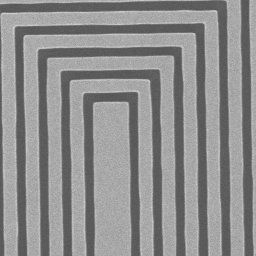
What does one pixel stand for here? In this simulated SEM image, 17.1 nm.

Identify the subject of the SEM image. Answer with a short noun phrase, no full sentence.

groups of lines, slits or small figures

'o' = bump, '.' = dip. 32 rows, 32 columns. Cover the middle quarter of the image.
ooooooooooooooooooooooooooo...oo
oooooooooooooo..........ooo...oo
........................ooo...oo
........................ooo...oo
..ooooooooooooooooooo...ooo...oo
.oooooooooooooooooooo...ooo...oo
.ooooooooooooooooooooo..ooo...oo
.oooo..............ooo..ooo...oo
.oooo..............ooo..ooo...oo
.oooo..............ooo..ooo...oo
..ooo..ooooooooo...ooo..ooo...oo
..ooo..ooooooooo...ooo..ooo...oo
..ooo..ooooooooo...ooo..ooo...oo
..ooo..ooooooooo...ooo..ooo...oo
..ooo..ooooooooo...ooo..ooo...oo
..ooo..ooooooooo...ooo..ooo...oo
..ooo..ooooooooo...ooo..ooo...oo
..ooo..ooooooooo...ooo..ooo...oo
..ooo..ooooooooo...ooo..ooo...oo
..ooo...oooooooo...ooo..ooo...oo
..ooo...oooooooo...ooo..ooo...oo
..ooo...oooooooo...ooo..ooo...oo
..ooo...oooooooo...ooo..oooo..oo
..ooo...oooooooo...ooo..oooo..oo
..ooo...oooooooo...ooo..oooo..oo
..ooo...ooooooooo..ooo..oooo..oo
..ooo...ooooooooo..ooo...ooo..oo
..ooo...ooooooooo..ooo...ooo..oo
..ooo...ooooooooo..ooo...ooo..oo
..ooo...ooooooooo..ooo...ooo..oo
..ooo...ooooooooo..ooo...ooo..oo
..ooo...ooooooooo..ooo...ooo..oo